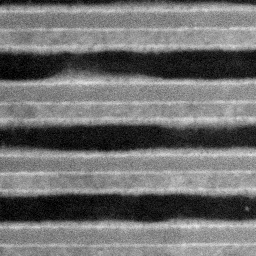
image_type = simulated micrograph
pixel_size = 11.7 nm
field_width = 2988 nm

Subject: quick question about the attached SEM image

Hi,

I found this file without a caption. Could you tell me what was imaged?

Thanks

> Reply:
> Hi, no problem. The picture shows lines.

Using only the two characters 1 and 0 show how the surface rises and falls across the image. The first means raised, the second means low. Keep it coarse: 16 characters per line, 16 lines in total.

0000000000000000
1111111111111111
1111111111111111
0000000000000000
0000000000000000
1111111111111111
1111111111111111
0000000000000000
0000000000000000
0000000000000000
1111111111111111
1111111111111111
0000000000000000
0000000000000000
1111111111111111
1111111111111111